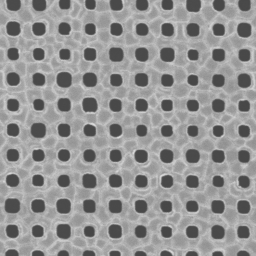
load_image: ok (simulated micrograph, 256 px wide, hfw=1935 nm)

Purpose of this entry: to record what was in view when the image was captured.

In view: a regular array of holes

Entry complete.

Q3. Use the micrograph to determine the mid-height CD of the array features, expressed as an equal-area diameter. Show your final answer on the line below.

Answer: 102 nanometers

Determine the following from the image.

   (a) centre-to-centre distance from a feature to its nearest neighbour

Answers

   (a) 190 nm